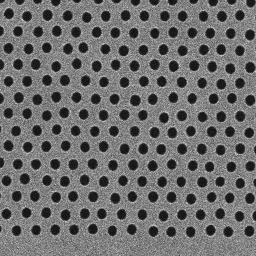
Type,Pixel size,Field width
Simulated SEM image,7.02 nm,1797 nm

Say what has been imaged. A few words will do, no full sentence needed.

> a regular array of holes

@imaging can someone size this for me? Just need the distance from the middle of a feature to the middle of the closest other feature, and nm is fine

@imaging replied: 126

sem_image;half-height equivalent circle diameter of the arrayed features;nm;68.1